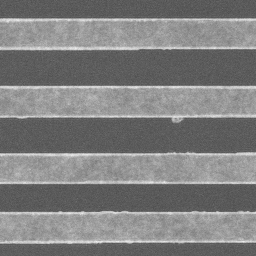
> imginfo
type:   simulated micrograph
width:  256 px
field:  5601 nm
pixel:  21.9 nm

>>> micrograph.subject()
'lines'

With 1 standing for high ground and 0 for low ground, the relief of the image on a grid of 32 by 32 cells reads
00000000000000000000000000000000
00000000000000000000000000000000
11111111111111111111111111111111
11111111111111111111111111111111
11111111111111111111111111111111
11111111111111111111111111111111
00000000000000000000000000000000
00000000000000000000000000000000
00000000000000000000000000000000
00000000000000000000000000000000
00000000000000000000000000000000
11111111111111111111111111111111
11111111111111111111111111111111
11111111111111111111111111111111
11111111111111111111111110000000
00000000000000000000000000000000
00000000000000000000000000000000
00000000000000000000000000000000
00000000000000000000000000000000
11111111111111111111111111111111
11111111111111111111111111111111
11111111111111111111111111111111
11111111111111111111111111111111
00000000000000000000000000000000
00000000000000000000000000000000
00000000000000000000000000000000
00000000000000000000000000000000
11111111111111111111111111111111
11111111111111111111111111111111
11111111111111111111111111111111
00000000000000000000000000000000
00000000000000000000000000000000